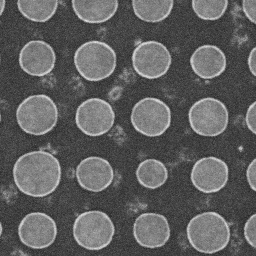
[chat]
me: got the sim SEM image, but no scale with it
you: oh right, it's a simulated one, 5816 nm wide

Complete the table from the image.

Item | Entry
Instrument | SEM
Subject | a regular array of raised bodies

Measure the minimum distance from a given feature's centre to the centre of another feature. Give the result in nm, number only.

1280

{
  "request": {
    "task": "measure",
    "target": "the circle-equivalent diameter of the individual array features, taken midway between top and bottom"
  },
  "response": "830 nm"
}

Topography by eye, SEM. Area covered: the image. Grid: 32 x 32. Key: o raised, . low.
o.ooooo..oooooo..ooooo..oooo..oo
...oooo..ooooo...oooo...oooo...o
....oo.....oo.....oo...........o
................................
................................
...ooo.....oo.....oo............
...oooo...oooo...oooo...oooo...o
...oooo..ooooo...oooo...oooo...o
...oooo...oooo...oooo...oooo...o
..........ooo.....oo.....oo.....
................................
..............o.................
...ooo.....o......oo.....oo.....
..ooooo...oooo...oooo...oooo...o
..ooooo...oooo...oooo...oooo...o
..ooooo...oooo...oooo...oooo...o
....oo.....oo.....oo.....ooo....
................................
................................
...ooo..........................
..ooooo...oooo....oo.....ooo...o
..ooooo..ooooo...oooo...oooo...o
..ooooo...oooo...oooo...oooo...o
..ooooo....oo............ooo....
....o...........................
................................
...........o....................
...oooo...oooo...oooo...oooo...o
...oooo..ooooo...oooo...oooo...o
...oooo..ooooo...oooo...ooooo..o
...ooo....ooo.....oo....oooo...o
..........................o.....